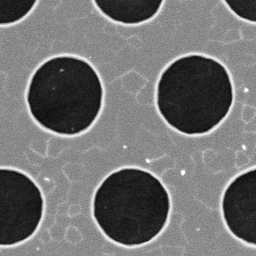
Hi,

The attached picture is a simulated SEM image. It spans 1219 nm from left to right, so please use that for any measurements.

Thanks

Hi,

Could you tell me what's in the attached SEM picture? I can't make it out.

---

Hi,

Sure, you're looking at holes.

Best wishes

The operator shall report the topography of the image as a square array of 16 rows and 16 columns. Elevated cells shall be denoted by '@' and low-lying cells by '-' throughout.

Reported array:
--@@@@----@@@@--
@@@@@@@@@@@@@@@@
@@@@@@@@@@@@@@@@
@@@@@@@@@@@@-@@@
@@----@@@@----@@
@@----@@@@----@@
@@----@@@@----@@
@@----@@@@----@@
@@@@@@@@@@@@@@@@
@@@@@@@@@@@@@@@@
@@@@@@@@@@@@@@@@
--@@@@----@@@@--
---@@@-----@@@--
---@@@----@@@@--
--@@@@@---@@@@@-
@@@@@@@@@@@@@@@@